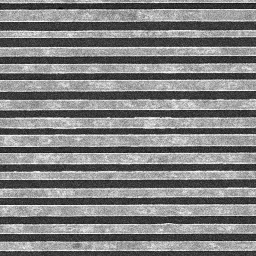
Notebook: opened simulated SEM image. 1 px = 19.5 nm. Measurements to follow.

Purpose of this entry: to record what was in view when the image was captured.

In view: parallel lines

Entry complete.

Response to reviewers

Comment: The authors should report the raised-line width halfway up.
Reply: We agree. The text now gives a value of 190 nm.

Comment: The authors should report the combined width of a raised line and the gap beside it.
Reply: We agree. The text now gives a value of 0.346 µm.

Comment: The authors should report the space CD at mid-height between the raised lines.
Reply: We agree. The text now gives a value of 8 pixels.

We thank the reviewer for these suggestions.